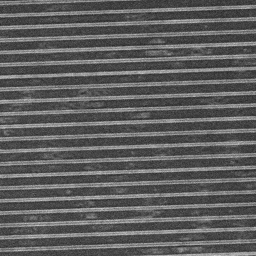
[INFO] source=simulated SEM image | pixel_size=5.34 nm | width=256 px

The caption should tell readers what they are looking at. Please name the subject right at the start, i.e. parallel lines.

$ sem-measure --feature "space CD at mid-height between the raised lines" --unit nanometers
49.4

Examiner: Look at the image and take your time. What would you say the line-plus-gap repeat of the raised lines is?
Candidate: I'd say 65.8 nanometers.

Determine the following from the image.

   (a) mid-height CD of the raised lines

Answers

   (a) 18 nm